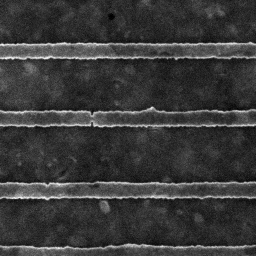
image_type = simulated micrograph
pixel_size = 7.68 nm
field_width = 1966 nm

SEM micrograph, one or a few lines or trenches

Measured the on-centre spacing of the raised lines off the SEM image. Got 533 nm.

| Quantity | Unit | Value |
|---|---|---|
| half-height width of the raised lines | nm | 110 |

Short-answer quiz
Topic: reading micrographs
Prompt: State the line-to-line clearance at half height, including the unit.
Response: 407 nm